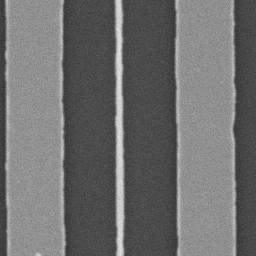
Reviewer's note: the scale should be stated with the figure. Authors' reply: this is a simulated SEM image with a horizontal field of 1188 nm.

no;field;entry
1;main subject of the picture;lines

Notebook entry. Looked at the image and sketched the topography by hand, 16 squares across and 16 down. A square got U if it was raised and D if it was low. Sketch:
UUUUDDDDDDDUUUUD
UUUUDDDDDDDUUUUD
UUUUDDDDDDDUUUUD
UUUUDDDDDDDUUUUD
UUUUDDDDDDDUUUUD
UUUUDDDDDDDUUUUD
UUUUDDDDDDDUUUUD
UUUUDDDDDDDUUUUD
UUUUDDDDDDDUUUUD
UUUUDDDDDDDUUUUD
UUUUDDDDDDDUUUUD
UUUUDDDDDDDUUUUD
UUUUDDDDDDDUUUUD
UUUUDDDDDDDUUUUD
UUUUDDDDDDDUUUUD
UUUUDDDDDDDUUUUD